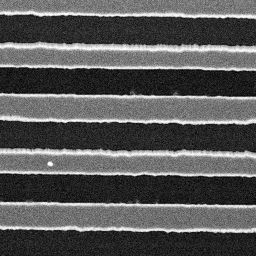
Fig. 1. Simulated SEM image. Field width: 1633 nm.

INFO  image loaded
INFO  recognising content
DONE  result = lines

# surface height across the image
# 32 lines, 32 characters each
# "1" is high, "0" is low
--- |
11111111111111111111111111111111
11111111111111111111111111111111
00000000000000000000000000000000
00000000000000000000000000000000
00000000000000000000000000000000
01000000000000000000000000000000
11111111111111111111111111111111
11111111111111111111111111111111
00000000110101111111111111111111
00000000000000000000000000000000
00000000000000000000000000000000
00000000000000000000000000000000
11111111111111111111111111111111
11111111111111111111111111111111
11111111111111111111111111111111
00000000000000000000000111010010
00000000000000000000000000000000
00000000000000000000000000000000
00000000000000000000000000000000
11111111111111111111111111111111
11111111111111111111111111111111
11111111111111111111111111111111
00000000000000000000000000000000
00000000000000000000000000000000
00000000000000000000000000000000
11111111111111110000000000000000
11111111111111111111111111111111
11111111111111111111111111111111
11111111111111111111111111111111
00000000000000000000000000000000
00000000000000000000000000000000
00000000000000000000000000000000